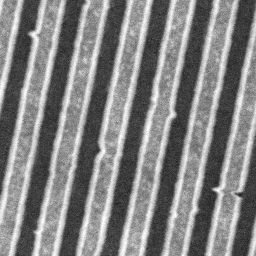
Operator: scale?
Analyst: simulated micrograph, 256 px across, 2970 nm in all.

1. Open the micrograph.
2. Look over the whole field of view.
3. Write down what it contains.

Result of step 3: parallel lines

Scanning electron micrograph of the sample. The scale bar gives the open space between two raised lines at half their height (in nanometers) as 254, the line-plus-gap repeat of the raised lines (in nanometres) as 491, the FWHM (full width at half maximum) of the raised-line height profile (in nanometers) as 234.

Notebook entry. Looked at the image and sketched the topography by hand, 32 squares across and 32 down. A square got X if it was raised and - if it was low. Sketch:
XX---XXX---XX---XXX---XX---XX---
XX---XXX--XXX---XX---XXX---XX---
XX---XX---XXX---XX---XXX---XX---
XX---XX---XXX---XX---XXX--XXX---
XX--XXX---XXX--XXX---XX---XXX---
XX--XXX---XX---XXX--XXX---XXX--X
X---XXX--XXX---XX---XXX---XX---X
X---XXX--XXX---XX---XXX---XX---X
X---XX---XXX--XXX---XX---XXX---X
X--XXX---XX---XXX---XX---XXX--XX
---XXX---XX---XXX--XXX---XXX--XX
---XXX--XXX---XX---XXX---XX---XX
---XX---XXX---XX---XXX--XXX---XX
---XX---XXX--XXX---XXX--XXX---XX
---XX---XX---XXX---XXX--XXX--XXX
--XXX---XX---XXX--XXX---XX---XXX
--XXX--XXX---XX---XXX---XX---XXX
--XX---XXX---XX---XXX--XXX---XX-
--XX---XXX---XX---XX---XXX---XX-
--XX---XX---XXX---XX---XXX--XXX-
-XXX---XX---XXX--XXX---XX---XXX-
-XXX--XXX---XX---XXX---XX---XXX-
-XX---XXX---XX---XXX--XXX---XX--
-XX---XXX--XXX---XX---XXX--XXX--
XXX---XX---XXX---XX---XXX--XXX--
XXX---XX---XXX---XX---XX---XXX--
XXX--XXX---XX---XXX---XX---XXX--
XX---XXX---XX---XXX--XXX---XX---
XX---XXX--XXX---XX---XXX---XX---
XX---XX---XXX---XX---XXX--XXX---
XX---XX---XXX--XXX---XX---XXX---
XX--XXX---XX---XXX---XX---XXX--X